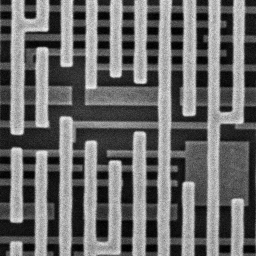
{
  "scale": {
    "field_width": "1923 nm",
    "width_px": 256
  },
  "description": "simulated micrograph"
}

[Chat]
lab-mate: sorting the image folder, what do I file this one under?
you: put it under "wiring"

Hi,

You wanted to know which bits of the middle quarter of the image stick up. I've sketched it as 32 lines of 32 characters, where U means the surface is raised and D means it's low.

DDDDDDUUDDDDUUDDDUUUUDDDUUUDDDUU
DDDDDUUUDDDDUUDDDUUUDDDDUUUDDDUU
DDDDDUUUDDDDUUDDDDUUDDDDUUUDDDUU
DDDDDUUUDDDDDDDDDDUUDDDDUUUDDDUU
DDDDDDUUDDDDDDDDDDUUDDDDUUUDDDUU
DDDDDDUUDDDDDDDDDDDDDDDDUUUDDDUU
DDDDDDDDDDDDDDDDDDDDDDDDUUUDDDUU
DDDDDDDDDDDDDDDDDDDDDDDDUUUDDDUU
DDDDDDDDDDDDDDDDDDDDDDDDUUUDDDUU
DDDDDDDDDDDDDDDDDDDDDDDDUUUDDDUU
DDDDDDDDDDDDDDDDDDDDDDDDUUUDDDUU
DDDDDDDDDDDDDDDDDDDDDDDDUUUDDDUU
DDDDDDDDDDDDDDDDDDDDDDDDUUUDDDUU
UUDDDDDDDDDDDDDDDDDDDDDDUUUDDDDD
UUDDDDDDDDDDDDDDDDDDDDDDUUUDDDDD
UUDDDDDDDDDDDDDDDDDDDDDDUUUDDDDD
UUDDDDDDDDDDDDDDDDDDDDDDUUUDDDDD
UUDDDDDDDDDDDDDDDUUUDDDDUUUDDDDD
UUDDDDDDDDDDDDDDDUUUDDDDUUUDDDDD
UUDDDDUUDDDDDDDDDUUUDDDDUUUDDDDD
UUDDDUUUDDDDDDDDDUUUDDDDUUUDDDDD
UUDDDUUUDDDDDDDDDUUUDDDDUUUDDDDD
UUDDDUUUDDDDDDDDDUUUDDDDUUUDDDDD
UUDDDUUUDDDDDDDDDUUUDDDDUUUDDDDD
UUDDDUUUDDDUUUDDDUUUDDDDUUDDDDDD
UUDDDUUUDDDUUUDDDUUUDDDDUUDDDDDD
UUDDDUUUDDDUUUDDDUUUDDDDUUDDDDDD
UUDDDUUUDDDUUUDDDUUUDDDDUUDDDDDD
UUDDDUUUDDDUUUDDDUUUDDDDUUUDDDDD
UUDDDUUUDDDUUUDDDUUUDDDDUUUDDDDD
UUDDDUUUDDDUUUDDDUUUDDDDUUUDDDUU
UUDDDUUUDDDUUUDDDUUUDDDDUUUDDDUU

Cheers